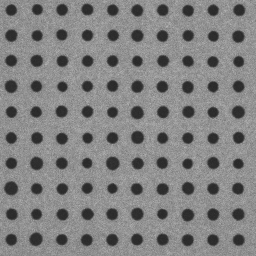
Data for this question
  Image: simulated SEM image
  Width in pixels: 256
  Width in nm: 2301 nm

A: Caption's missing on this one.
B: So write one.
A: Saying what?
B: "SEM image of a regular array of holes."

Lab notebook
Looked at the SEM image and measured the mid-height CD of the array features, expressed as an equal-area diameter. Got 97.8 nm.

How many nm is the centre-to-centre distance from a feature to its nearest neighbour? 222